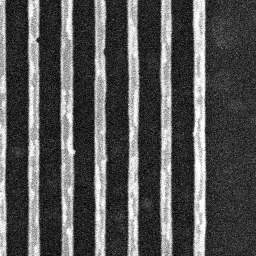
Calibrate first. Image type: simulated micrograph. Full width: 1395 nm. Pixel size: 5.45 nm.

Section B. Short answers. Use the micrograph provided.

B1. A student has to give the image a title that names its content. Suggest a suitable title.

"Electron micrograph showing parallel lines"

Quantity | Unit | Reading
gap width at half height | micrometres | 0.133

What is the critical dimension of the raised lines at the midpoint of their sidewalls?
8.99 pixels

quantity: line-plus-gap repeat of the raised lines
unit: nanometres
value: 180